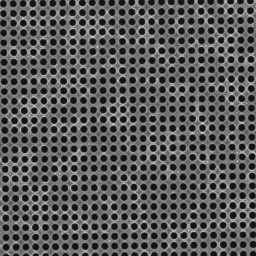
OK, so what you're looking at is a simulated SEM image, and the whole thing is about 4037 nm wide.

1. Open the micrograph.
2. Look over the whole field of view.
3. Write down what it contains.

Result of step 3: a regular array of holes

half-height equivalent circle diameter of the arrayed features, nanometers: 110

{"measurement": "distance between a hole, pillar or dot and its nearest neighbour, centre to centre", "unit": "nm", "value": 148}